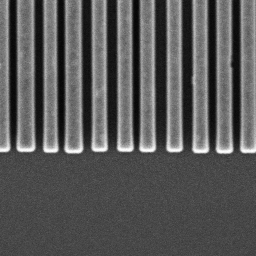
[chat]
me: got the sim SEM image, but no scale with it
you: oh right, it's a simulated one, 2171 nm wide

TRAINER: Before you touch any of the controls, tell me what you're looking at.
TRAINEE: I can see parallel lines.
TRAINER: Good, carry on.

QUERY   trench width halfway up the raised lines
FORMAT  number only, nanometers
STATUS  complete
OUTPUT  86.9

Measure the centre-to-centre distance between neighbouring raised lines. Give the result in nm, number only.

210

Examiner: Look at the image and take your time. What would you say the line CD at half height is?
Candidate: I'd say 0.122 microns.